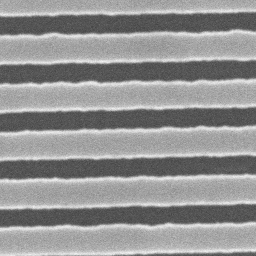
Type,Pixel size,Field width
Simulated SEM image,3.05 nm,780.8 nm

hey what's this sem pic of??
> lines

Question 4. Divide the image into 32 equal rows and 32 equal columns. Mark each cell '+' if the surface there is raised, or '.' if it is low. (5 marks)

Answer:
++++++++++++++++++++++++++++++++
++++++++++++++++++++++++++++++..
................................
................................
..++++++++++++++++++++++++++++++
++++++++++++++++++++++++++++++++
++++++++++++++++++++++++++++++++
+++++++++++++++++++++++++++..+++
................................
................................
...+...++.++++++++++++++++++++++
++++++++++++++++++++++++++++++++
++++++++++++++++++++++++++++++++
+++++++++++++++++++++++.........
................................
................................
...+++++++++++++++++++++++++++++
++++++++++++++++++++++++++++++++
++++++++++++++++++++++++++++++++
+++++++++++++++++++++++++.......
................................
................................
...+++++.+++++++++++++++++++++++
++++++++++++++++++++++++++++++++
++++++++++++++++++++++++++++++++
+++++++++++++++++++++++++++++...
................................
................................
.++.++++++++++++++++++++++++++++
++++++++++++++++++++++++++++++++
++++++++++++++++++++++++++++++++
+++++++++++++++++++++++++++++...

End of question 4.